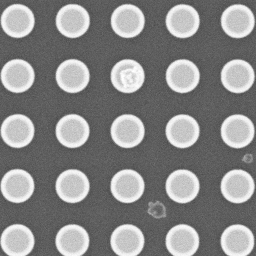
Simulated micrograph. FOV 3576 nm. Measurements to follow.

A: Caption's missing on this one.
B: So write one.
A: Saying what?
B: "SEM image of an array of small figures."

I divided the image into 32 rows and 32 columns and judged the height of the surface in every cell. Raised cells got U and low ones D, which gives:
DDDDDDDDDDDDDDDDDDDDDDDDDDDDDDDD
UUUUDDDUUUUDDDUUUUDDDUUUUDDDUUUD
UUUUDDDUUUUDDDUUUUDDDUUUUDDDUUUU
UUUUDDDUUUUDDDUUUUDDDUUUUDDDUUUU
DUUDDDDDUUDDDDDUUDDDDDUUDDDDDUUD
DDDDDDDDDDDDDDDDDDDDDDDDDDDDDDDD
DDDDDDDDDDDDDDDDDDDDDDDDDDDDDDDD
DDUDDDDDUUDDDDDDDDDDDDDDDDDDDDDD
UUUUDDDUUUUDDDUUUUDDDUUUUDDDUUUD
UUUUDDDUUUUDDDUUUUDDDUUUUDDDUUUU
UUUUDDDUUUUDDDUUUUDDDUUUUDDDUUUU
DDUDDDDDDUDDDDDUUDDDDDUDDDDDDUDD
DDDDDDDDDDDDDDDDDDDDDDDDDDDDDDDD
DDDDDDDDDDDDDDDDDDDDDDDDDDDDDDDD
DUUDDDDDUUDDDDDUUDDDDDUUDDDDDUDD
UUUUDDDUUUUDDDUUUUDDDUUUUDDDUUUU
UUUUDDDUUUUDDDUUUUDDDUUUUDDDUUUU
UUUUDDDUUUUDDDUUUUDDDUUUUDDDUUUD
DDDDDDDDDDDDDDDDDDDDDDDDDDDDDDDD
DDDDDDDDDDDDDDDDDDDDDDDDDDDDDDDD
DDDDDDDDDDDDDDDDDDDDDDDDDDDDDDDD
DUUDDDDDUUDDDDDUUDDDDDUUDDDDDUUD
UUUUDDDUUUUDDDUUUUDDDUUUUDDDUUUU
UUUUDDDUUUUDDDUUUUDDDUUUUDDDUUUU
DUUUDDDUUUUDDDUUUUDDDUUUDDDDUUUD
DDDDDDDDDDDDDDDDDDDDDDDDDDDDDDDD
DDDDDDDDDDDDDDDDDDDUDDDDDDDDDDDD
DDDDDDDDDDDDDDDDDDDDDDDDDDDDDDDD
DUUDDDDDUUDDDDDUUDDDDDUUDDDDDUUD
UUUUDDDUUUUDDDUUUUDDDUUUUDDDUUUU
UUUUDDDUUUUDDDUUUUDDDUUUUDDDUUUU
DUUUDDDDUUUDDDUUUDDDDUUUDDDDUUUD